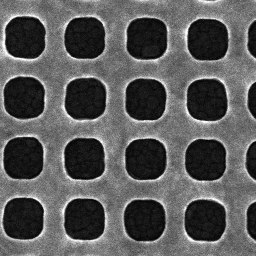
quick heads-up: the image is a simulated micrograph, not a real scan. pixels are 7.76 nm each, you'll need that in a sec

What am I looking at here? a regular array of holes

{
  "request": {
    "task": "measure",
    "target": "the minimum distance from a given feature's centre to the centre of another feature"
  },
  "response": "60 px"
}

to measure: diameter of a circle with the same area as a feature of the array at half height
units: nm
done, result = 338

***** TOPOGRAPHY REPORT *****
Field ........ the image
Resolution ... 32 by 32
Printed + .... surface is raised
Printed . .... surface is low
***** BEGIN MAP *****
++++++++++++++++++++++++++++++++
++++++++++++++++++++++++++++++++
+....++++...+++++...+++++..+++++
+.....++.....+++.....+++....+++.
+.....++.....+++.....++......++.
+.....++.....+++.....++......++.
+....+++.....+++.....+++....+++.
+++++++++++++++++++++++++..+++++
++++++++++++++++++++++++++++++++
++++++++++++++++++++++++++++++++
+....++++....+++....++++....++++
......++.....+++.....++.....+++.
......++.....+++.....++.....+++.
+.....++.....+++.....++.....+++.
+....++++...++++....++++....++++
++++++++++++++++++++++++++++++++
++++++++++++++++++++++++++++++++
+....++++...+++++...+++++..+++++
+....+++.....+++.....++.....+++.
.....+++.....+++.....++.....+++.
.....+++.....+++.....++.....+++.
+....+++.....+++....+++.....+++.
++++++++++.++++++.+++++++..+++++
++++++++++++++++++++++++++++++++
++++++++++++++++++++++++++++++++
+....+++.....+++....++++....+++.
+....+++.....+++.....++.....+++.
.....+++.....++......++.....+++.
.....+++.....+++.....++.....+++.
+....++++....+++....++++....+++.
++++++++++++++++++++++++++++++++
++++++++++++++++++++++++++++++++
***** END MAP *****